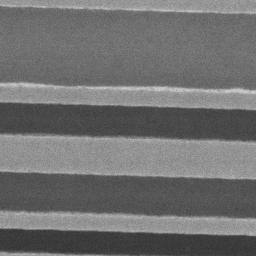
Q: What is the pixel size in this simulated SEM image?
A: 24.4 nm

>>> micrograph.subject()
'lines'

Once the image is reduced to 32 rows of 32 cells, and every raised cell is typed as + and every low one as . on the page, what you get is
++++++++++++++++++++++++++++++++
...........................+++++
................................
................................
................................
................................
................................
................................
................................
................................
................................
++++++++++++++++++++++++++++++..
++++++++++++++++++++++++++++++++
..........................++++++
................................
................................
................................
+++++++++++++++++++++...........
++++++++++++++++++++++++++++++++
++++++++++++++++++++++++++++++++
++++++++++++++++++++++++++++++++
.....+++++++++++++++++++++++++++
................................
................................
................................
................................
................................
++++++++++++++++++++++++++++++++
..++++++++++++++++++++++++++++++
................................
................................
................................